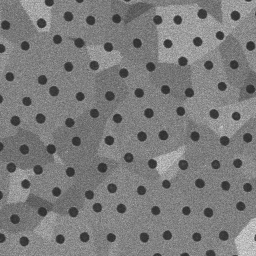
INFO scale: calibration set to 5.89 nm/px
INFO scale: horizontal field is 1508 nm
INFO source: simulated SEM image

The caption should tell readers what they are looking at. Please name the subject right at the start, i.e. a regular array of holes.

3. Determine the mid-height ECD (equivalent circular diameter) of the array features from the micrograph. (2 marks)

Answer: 57.9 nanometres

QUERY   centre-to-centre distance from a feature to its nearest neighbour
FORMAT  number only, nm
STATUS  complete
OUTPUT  136